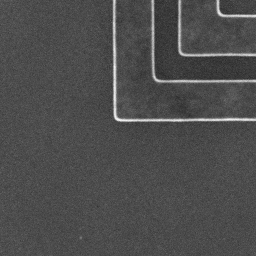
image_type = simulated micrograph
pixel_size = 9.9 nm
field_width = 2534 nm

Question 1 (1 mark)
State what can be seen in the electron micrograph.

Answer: groups of lines, slits or small figures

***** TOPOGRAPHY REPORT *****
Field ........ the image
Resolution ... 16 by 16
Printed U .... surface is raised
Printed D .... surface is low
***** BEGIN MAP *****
DDDDDDDUUUDUUUDD
DDDDDDDUUUDUUUUU
DDDDDDDUUUDUUUUU
DDDDDDDUUUDDDDDD
DDDDDDDUUUDDDDDD
DDDDDDDUUUUUUUUU
DDDDDDDUUUUUUUUU
DDDDDDDDUUUUUUDD
DDDDDDDDDDDDDDDD
DDDDDDDDDDDDDDDD
DDDDDDDDDDDDDDDD
DDDDDDDDDDDDDDDD
DDDDDDDDDDDDDDDD
DDDDDDDDDDDDDDDD
DDDDDDDDDDDDDDDD
DDDDDDDDDDDDDDDD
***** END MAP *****